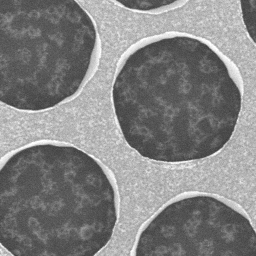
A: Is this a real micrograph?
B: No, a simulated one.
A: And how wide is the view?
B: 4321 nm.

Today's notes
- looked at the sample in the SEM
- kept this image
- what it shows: holes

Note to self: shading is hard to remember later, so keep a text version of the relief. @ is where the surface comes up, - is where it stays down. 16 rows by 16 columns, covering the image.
-----@@@---@@@@-
------@@@@@@@@@-
------@@@@--@@@@
------@@------@@
------@-------@@
-----@@--------@
----@@@--------@
@@@@@@@--------@
@@@@@@@@------@@
@----@@@@----@@@
------@@@@@@@@@@
-------@@@@@@@@@
-------@@@@---@@
-------@@@-----@
-------@@-------
------@@@-------